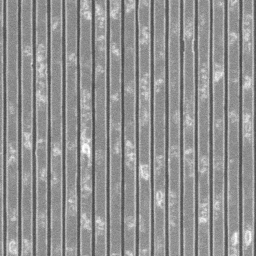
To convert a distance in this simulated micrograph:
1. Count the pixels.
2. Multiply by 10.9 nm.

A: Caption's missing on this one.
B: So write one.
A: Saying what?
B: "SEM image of parallel lines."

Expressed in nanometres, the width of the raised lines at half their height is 123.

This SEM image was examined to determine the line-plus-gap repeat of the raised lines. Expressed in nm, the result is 162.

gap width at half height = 41 nanometres